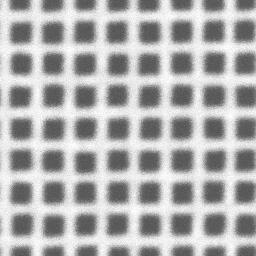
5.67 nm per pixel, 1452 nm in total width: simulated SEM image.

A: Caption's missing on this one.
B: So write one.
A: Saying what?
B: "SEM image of a regular array of holes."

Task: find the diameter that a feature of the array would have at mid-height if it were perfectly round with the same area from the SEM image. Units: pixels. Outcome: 25.8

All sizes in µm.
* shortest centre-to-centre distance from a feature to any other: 0.179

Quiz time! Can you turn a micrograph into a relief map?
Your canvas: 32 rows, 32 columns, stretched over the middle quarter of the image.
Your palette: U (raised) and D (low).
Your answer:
UUDDDDDDUUDDDDDDDUDDDDDDUUDDDDDD
UUDDDDDDUUDDDDDDDUDDDDDDUUDDDDDD
UUDDDDDDUUUDDDDDUUDDDDDDUUUDDDDD
UUUUUUUUUUUUUUUUUUUUUUUUUUUUUUUU
UUUUUUUUUUUUUUUUUUUUUUUUUUUUUUUU
UUUDDDDDUUUDDDDDUUUUDDDDUUUDDDDD
UUUDDDDDUUUDDDDDUUUDDDDDDUUDDDDD
UUDDDDDDUUUDDDDDUUUDDDDDDUUDDDDD
UUDDDDDDUUUDDDDDUUDDDDDDUUUDDDDD
UUDDDDDDUUUDDDDDUUDDDDDDUUUDDDDD
UUUDDDDDUUUDDDDDUUUDDDDDUUUDDDDD
UUUUUUUUUUUUUUUUUUUUUUUUUUUUUUUU
UUUUUUUUUUUUUUUUUUUUUUUUUUUUUUUU
UUUDDDDDUUUUDDDDUUUUDDDDUUUDDDDD
UUUDDDDDDUUDDDDDDUUDDDDDDUUDDDDD
UUUDDDDDUUUDDDDDDUUDDDDDDUUDDDDD
UUDDDDDDUUUDDDDDDUUDDDDDDUUDDDDD
UUDDDDDDUUUDDDDDDUUDDDDDDUUDDDDD
UUUDDDDDUUUDDDDDUUUDDDDDUUUDDDDD
UUUUUUUUUUUUUUUUUUUUUUUUUUUUUUUU
UUUUUUUUUUUUUUUUUUUUUUUUUUUUUUUU
UUUUUUUUUUUDDDDDUUUUDDDUUUUDDDDD
UUUDDDDDUUUDDDDDUUUDDDDDUUUDDDDD
UUDDDDDDUUUDDDDDDUUDDDDDUUUDDDDD
UUDDDDDDUUUDDDDDDUDDDDDDUUUDDDDD
UUDDDDDDUUUDDDDDDUDDDDDDUUUDDDDD
UUDDDDDDUUUDDDDDUUUDDDDDUUUDDDDD
UUUDDDDUUUUUUUUUUUUUUUUUUUUUUUUU
UUUUUUUUUUUUUUUUUUUUUUUUUUUUUUUU
UUUDDDDDUUUDDDDDUUUUDDDDUUUDDDDD
UUUDDDDDUUUDDDDDUUUDDDDDUUUDDDDD
UUDDDDDDUUUDDDDDUUUDDDDDUUUDDDDD